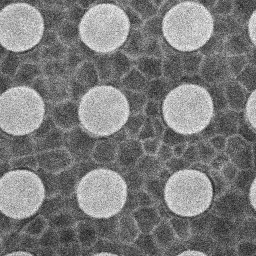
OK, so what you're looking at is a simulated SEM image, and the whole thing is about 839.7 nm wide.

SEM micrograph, raised bodies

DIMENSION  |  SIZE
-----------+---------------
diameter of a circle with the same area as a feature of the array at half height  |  162 nm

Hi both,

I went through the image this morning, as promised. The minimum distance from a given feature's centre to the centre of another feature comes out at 0.271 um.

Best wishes